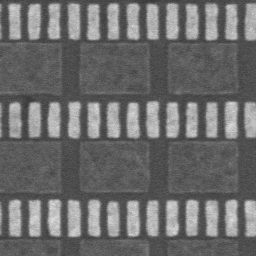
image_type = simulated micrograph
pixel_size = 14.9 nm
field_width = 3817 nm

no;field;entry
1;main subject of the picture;wiring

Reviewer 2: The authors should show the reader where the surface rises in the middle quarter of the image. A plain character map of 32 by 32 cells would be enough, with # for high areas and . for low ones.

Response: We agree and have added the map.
....#################.....######
....#################.....######
....#################.....######
....#################.....######
....#################.....######
....#################.....######
....#################.....######
................................
................................
................................
.###..###..##...##...##...##...#
.###..###..##...##...##...##...#
.##...###..##...##...##...##...#
..#...###..##...##...##...##...#
.##...###..##...##...##...##...#
.###..###..###..##...##...##...#
.###..###..###..###..##...##...#
.###..###..##...###..##...##...#
................................
.................###............
....#################.....######
....#################.....######
....#################.....######
....#################.....######
....#################.....######
....#################.....######
....#################.....######
....#################.....######
....#################.....######
....#################.....######
....#################.....######
....#################.....######